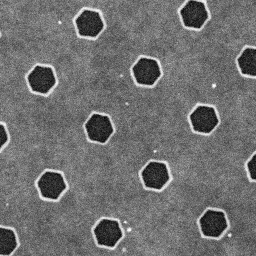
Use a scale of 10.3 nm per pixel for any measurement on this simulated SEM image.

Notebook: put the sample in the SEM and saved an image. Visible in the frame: a regular array of holes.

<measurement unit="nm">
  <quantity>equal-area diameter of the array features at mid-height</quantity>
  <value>293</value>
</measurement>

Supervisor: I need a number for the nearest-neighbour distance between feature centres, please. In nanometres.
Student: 759